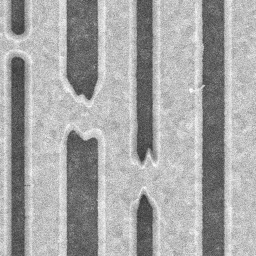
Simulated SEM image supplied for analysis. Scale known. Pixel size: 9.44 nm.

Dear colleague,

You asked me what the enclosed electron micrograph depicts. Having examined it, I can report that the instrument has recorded one or a few lines or trenches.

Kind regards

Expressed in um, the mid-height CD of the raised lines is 0.336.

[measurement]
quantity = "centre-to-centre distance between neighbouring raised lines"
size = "617 nanometres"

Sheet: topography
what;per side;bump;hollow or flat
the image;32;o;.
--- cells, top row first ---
o...oooo.....oooo...ooooo....ooo
o...oooo.....oooo...ooooo....ooo
o...oooo.....oooo..oooooo....ooo
o...oooo.....oooo..oooooo....ooo
o..ooooo.....oooo...ooooo....ooo
oooooooo.....oooo...ooooo....ooo
oooooooo.....oooo...ooooo....ooo
o..ooooo.....oooo..oooooo....ooo
o...oooo.....oooo...ooooo....ooo
o...oooo.....oooo..oooooo....ooo
o...oooo....ooooo...ooooo....ooo
o...ooooo...ooooo...ooooo....ooo
o...ooooooo.ooooo...ooooo....ooo
o...ooooooooooooo...ooooo....ooo
o...ooooooooooooo..oooooo....ooo
o...ooooooooooooo..oooooo....ooo
o...oooo..ooooooo...ooooo....ooo
o...oooo.....oooo...ooooo....ooo
o...oooo.....oooo..oooooo....ooo
o...oooo.....oooo.ooooooo....ooo
o...oooo.....oooooooooooo....ooo
o...oooo.....oooooooooooo....ooo
o...oooo.....oooooooooooo....ooo
o...oooo.....oooooooooooo....ooo
o...oooo.....oooooooooooo....ooo
o...oooo.....oooo..oooooo....ooo
o...oooo.....oooo..oooooo....ooo
o...oooo.....oooo...ooooo....ooo
o...oooo.....oooo...ooooo....ooo
o...oooo.....oooo...ooooo....ooo
o...oooo.....oooo..oooooo....ooo
o...oooo.....oooo...ooooo....ooo